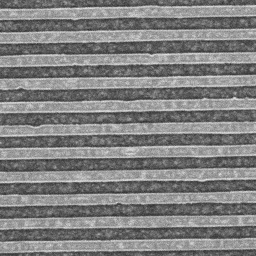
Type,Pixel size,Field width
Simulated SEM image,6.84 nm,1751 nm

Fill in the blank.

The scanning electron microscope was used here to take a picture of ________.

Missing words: parallel lines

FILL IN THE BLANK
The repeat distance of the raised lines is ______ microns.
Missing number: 0.159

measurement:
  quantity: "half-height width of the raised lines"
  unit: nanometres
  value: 65.9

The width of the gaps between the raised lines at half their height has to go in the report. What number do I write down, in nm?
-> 92.4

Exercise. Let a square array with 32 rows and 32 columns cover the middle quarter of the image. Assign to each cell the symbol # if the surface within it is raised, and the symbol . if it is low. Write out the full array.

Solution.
................................
................................
................................
......##..............##########
################################
################################
................................
................................
................................
.......#########################
################################
#####################.........##
................................
................................
................................
################################
################################
###.............................
................................
................................
................................
################################
################################
................................
................................
................................
.............................###
################################
################################
................................
................................
................................